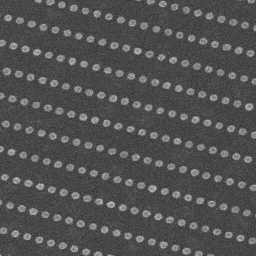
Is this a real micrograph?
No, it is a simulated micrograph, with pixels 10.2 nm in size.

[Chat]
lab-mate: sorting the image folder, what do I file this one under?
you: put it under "a regular array of raised bodies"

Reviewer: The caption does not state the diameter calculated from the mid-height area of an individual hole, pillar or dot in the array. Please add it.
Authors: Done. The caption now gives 70.6 nm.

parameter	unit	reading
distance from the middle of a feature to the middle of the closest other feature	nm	122